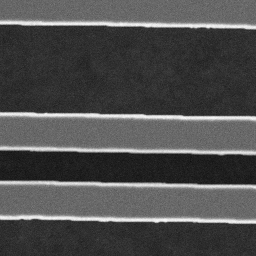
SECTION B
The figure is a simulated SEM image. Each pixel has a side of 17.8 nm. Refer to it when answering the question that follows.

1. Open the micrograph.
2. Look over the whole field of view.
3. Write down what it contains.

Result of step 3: lines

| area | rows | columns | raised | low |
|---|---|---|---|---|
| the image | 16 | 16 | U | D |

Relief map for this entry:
UUUUUUUUUUUUUUUU
DDDUUUUUUUUUUUUU
DDDDDDDDDDDDDDDD
DDDDDDDDDDDDDDDD
DDDDDDDDDDDDDDDD
DDDDDDDDDDDDDDDD
DDDDDDDDDDDDDDDD
UUUUUUUUUUUUUUUU
UUUUUUUUUUUUUUUU
DDDDDDDDDDUUUUUU
DDDDDDDDDDDDDDDD
UUUUUUUUDDDDDDDD
UUUUUUUUUUUUUUUU
UUUUUUUUUUUUUUUU
DDDDDDDDDDDDDDDD
DDDDDDDDDDDDDDDD